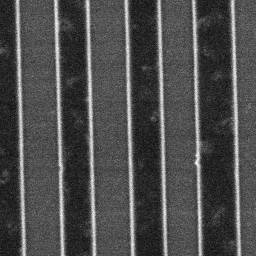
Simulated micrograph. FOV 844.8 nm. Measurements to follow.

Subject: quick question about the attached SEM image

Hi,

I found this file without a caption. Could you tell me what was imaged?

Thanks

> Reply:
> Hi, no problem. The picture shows one or a few lines or trenches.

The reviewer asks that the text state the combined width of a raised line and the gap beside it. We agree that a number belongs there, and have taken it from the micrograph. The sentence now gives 233 nm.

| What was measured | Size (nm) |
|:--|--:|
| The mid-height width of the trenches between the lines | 122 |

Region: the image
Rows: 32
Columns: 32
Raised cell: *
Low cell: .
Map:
**.....****.....****....*****...
**.....****.....****....*****...
**.....****.....****....*****...
**.....****.....****....*****...
**.....****.....****....*****...
**.....****.....****....*****...
**.....****.....****....*****...
**.....****.....****....*****...
**.....****.....****....*****...
**.....****.....****.....****...
**.....****.....****.....****...
***....****.....****.....****...
***....****.....****.....****...
***....****.....****.....****...
***....****.....****.....*****..
***....****.....****.....*****..
***....****.....****.....*****..
***....****.....****.....*****..
***....****.....****.....*****..
***....*****....****.....*****..
***....*****....****.....*****..
***.....****....****.....*****..
***.....****....****.....*****..
***.....****....*****....*****..
***.....****....*****....*****..
***.....****....*****....*****..
***.....****....*****....*****..
***.....****....*****....*****..
***.....****....*****....*****..
***.....****....*****....*****..
***.....****.....****....*****..
***.....****.....****....*****..